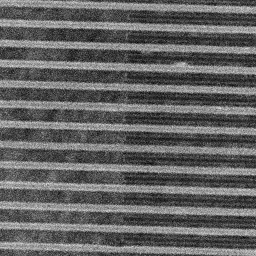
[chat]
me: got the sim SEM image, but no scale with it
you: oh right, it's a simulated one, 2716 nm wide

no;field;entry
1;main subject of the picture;parallel lines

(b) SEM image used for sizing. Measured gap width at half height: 49 nm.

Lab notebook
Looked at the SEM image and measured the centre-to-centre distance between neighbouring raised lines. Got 107 nm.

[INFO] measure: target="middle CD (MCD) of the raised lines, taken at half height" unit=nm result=55.7